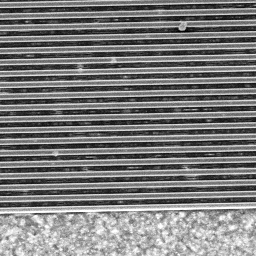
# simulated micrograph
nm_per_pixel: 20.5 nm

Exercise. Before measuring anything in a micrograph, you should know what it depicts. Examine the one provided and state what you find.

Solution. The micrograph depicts parallel lines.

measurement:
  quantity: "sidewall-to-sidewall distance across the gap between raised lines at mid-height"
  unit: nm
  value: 138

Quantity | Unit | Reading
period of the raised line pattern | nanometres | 234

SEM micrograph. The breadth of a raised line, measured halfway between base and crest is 4.87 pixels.